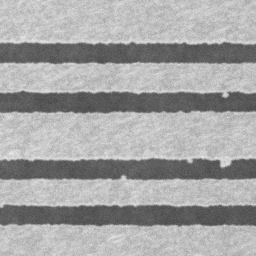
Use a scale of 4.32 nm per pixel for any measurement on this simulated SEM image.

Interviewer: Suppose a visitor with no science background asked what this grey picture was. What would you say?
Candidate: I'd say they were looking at lines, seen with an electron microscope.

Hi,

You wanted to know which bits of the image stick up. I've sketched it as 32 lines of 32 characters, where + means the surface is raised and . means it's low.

++++++++++++++++++++++++++++++++
++++++++++++++++++++++++++++++++
++++++++++++++++++++++++++++++++
++++++++++++++++++++++++++++++++
++++++++++++++++++++++++++++++++
................................
................................
................................
++++++++++++++++++++++++++++++++
++++++++++++++++++++++++++++++++
++++++++++++++++++++++++++++++++
+....+.++..+.....+.+.....+..+.++
................................
................................
++++++++++++++++++++++++++++++++
++++++++++++++++++++++++++++++++
++++++++++++++++++++++++++++++++
++++++++++++++++++++++++++++++++
++++++++++++++++++++++++++++++++
++++++++++++++++++++++++++++++++
................................
................................
....++++++..++.+.....++..+++..++
++++++++++++++++++++++++++++++++
++++++++++++++++++++++++++++++++
++++++++++++++++++++++++++++++++
................................
................................
++++++++++++++++++++++++++++++++
++++++++++++++++++++++++++++++++
++++++++++++++++++++++++++++++++
++++++++++++++++++++++++++++++++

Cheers